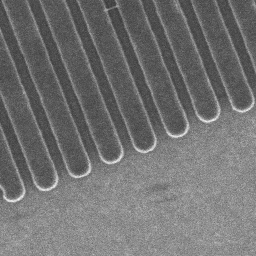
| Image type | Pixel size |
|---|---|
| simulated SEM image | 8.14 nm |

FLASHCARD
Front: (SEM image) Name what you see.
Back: parallel lines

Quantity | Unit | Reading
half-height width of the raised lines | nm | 191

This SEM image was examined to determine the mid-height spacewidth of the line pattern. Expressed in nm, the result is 94.8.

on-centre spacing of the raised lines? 282 nm